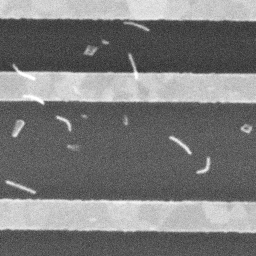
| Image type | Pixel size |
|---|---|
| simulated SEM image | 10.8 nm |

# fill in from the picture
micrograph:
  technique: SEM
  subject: lines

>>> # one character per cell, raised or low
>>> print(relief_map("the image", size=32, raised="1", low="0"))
11111111111111111111111111111111
11111111111111111111111111111111
00000000000000000000000000100111
00000000000000000000000000000000
00000000000000000000000000000000
00000000000000000000000000000000
00000000000000000000000000000000
00000000000000000000000000000000
00000000000000000000000000000000
11111111111111111111111111111111
11111111111111111111111111111111
11111111111111111111111111111111
11111111111111111111111111111111
00000000000000000000000000000000
00000000000000000000000000000000
00000000000000000000000000000000
00000000000000000000000000000000
00000000000000000000000000000000
00000000000000000000000000000000
00000000000000000000000000000000
00000000000000000000000000000000
00000000000000000000000000000000
00000000000000000000000000000000
00000000000000000000000000000000
00000000000000000000000000000000
11111111111111111111111111111111
11111111111111111111111111111111
11111111111111111111111111111111
11111111111111111111111111111111
00000000000000000000000000000000
00000000000000000000000000000000
00000000000000000000000000000000